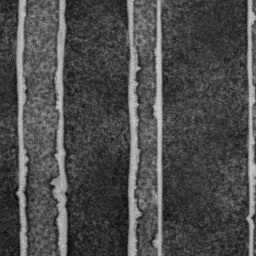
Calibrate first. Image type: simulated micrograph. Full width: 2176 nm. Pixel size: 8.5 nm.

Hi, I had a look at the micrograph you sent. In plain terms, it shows one or a few lines or trenches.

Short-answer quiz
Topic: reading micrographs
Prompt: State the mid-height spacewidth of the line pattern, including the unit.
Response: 0.687 µm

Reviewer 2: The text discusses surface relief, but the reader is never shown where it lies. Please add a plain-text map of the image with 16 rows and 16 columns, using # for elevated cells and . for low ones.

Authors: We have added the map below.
.###....##......
.###....##......
.###....##......
.###....##......
.###....##......
.###....##......
.###....##......
.###....##......
.###....##......
.###....##......
.###....##......
.###....##......
.###....##......
.###....##......
.###....##......
.###....##......